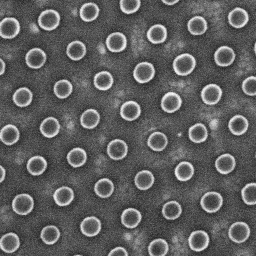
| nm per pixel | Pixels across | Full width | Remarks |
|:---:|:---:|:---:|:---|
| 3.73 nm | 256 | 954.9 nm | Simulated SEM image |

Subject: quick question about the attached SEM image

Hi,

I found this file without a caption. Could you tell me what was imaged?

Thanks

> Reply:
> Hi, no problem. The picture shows a regular array of raised bodies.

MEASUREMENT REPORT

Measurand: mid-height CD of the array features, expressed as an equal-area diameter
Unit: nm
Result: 70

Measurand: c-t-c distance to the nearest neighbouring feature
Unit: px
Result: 40.5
